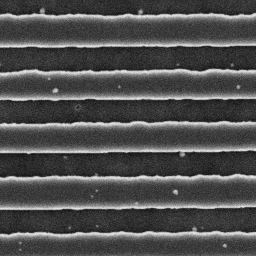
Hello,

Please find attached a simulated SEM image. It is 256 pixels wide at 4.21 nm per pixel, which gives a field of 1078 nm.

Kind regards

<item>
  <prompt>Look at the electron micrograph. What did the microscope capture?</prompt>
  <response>lines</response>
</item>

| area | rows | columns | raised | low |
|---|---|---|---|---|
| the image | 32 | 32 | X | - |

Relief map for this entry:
--------------------------------
--------------------------------
XXXXXXXXXXXXXXXXXXXXXXXXXXXXXXXX
XXXXXXXXXXXXXXXXXXXXXXXXXXXXXXXX
XXXXXXXXXXXXXXXXXXXXXXXXXXXXXXXX
XXXXXXXXXXXXXXXXXXXXXXXXXXXXXXXX
--------------------------------
--------------------------------
--------------------------------
XXXXXXXXXXXXXXXXXXXXXXXXXXXXXXXX
XXXXXXXXXXXXXXXXXXXXXXXXXXXXXXXX
XXXXXXXXXXXXXXXXXXXXXXXXXXXXXXXX
-XXX--XX------------------------
--------------------------------
--------------------------------
------XX-XXXXXXXXXXXXXXXXXXXXXXX
XXXXXXXXXXXXXXXXXXXXXXXXXXXXXXXX
XXXXXXXXXXXXXXXXXXXXXXXXXXXXXXXX
XXXXXXXXXXXXXXXXXXXXXXXXXXXXXXXX
--------------------------------
--------------------------------
--------------------------------
XXXXXXXXXXXXXXXXXXXXXXXXXXXXXXXX
XXXXXXXXXXXXXXXXXXXXXXXXXXXXXXXX
XXXXXXXXXXXXXXXXXXXXXXXXXXXXXXXX
XXXXXXXXXXXXXXXXXXXXXXXXXXXXXXXX
--------------------------------
--------------------------------
--------------------------------
XXXXXXXXXXXXXXXXXXXXXXXXXXXXXXXX
XXXXXXXXXXXXXXXXXXXXXXXXXXXXXXXX
XXXXXXXXXXXXXXXXXXXXXXXXXXXXXXXX